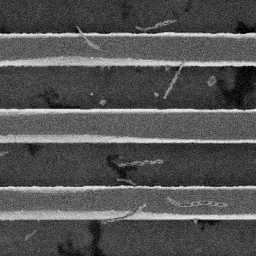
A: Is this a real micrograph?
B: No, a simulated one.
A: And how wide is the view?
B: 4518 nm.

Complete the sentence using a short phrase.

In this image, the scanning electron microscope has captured lines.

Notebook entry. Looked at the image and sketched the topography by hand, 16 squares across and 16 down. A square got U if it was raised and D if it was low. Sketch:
DDDDDDDDDDDDDDDD
DDDDDDDDDDDDDDDD
UUUUUUUUUUUUUUUU
UUUUUUUUUUUUUUUU
DDDDDDDDDDDDDDDD
DDDDDDDDDDDDDDDD
DDDDDDDDDDDDDDDD
UUUUUUUUUUUUUUUU
UUUUUUUUUUUUUUUU
DDDDDDDDDDDDDDDD
DDDDDDDDDDDDDDDD
DDDDDDDDDDDDDDDD
UUUUUUUUUUUUUUUU
UUUUUUUUUUUUUUUU
DDDDDDDDDDDDDDDD
DDDDDDDDDDDDDDDD